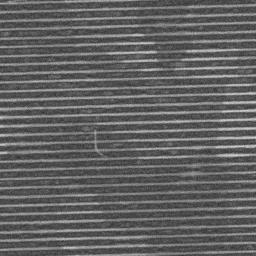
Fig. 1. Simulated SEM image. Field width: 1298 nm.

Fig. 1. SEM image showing parallel lines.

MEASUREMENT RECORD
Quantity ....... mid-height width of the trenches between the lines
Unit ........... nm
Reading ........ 36.1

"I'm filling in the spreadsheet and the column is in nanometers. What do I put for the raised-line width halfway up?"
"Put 10.8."